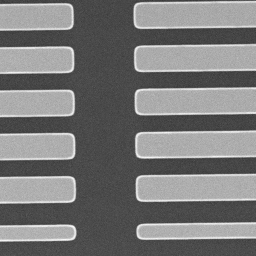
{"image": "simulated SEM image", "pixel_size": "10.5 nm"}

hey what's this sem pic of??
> groups of lines, slits or small figures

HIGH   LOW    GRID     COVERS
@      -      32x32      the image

-----------------@@@@@@@@@@@@@@@
@@@@@@@@@--------@@@@@@@@@@@@@@@
@@@@@@@@@--------@@@@@@@@@@@@@@@
@@@@@@@@@--------@@@@@----------
--------------------------------
--------------------------------
@@@@@@@@@--------@@@@@@@@@@@@@@@
@@@@@@@@@--------@@@@@@@@@@@@@@@
@@@@@@@@@--------@@@@@@@@@@@@@@@
--------------------------------
--------------------------------
@@@@@@@@@--------@@@@@@@@@@@@@@@
@@@@@@@@@--------@@@@@@@@@@@@@@@
@@@@@@@@@--------@@@@@@@@@@@@@@@
@@@@@---------------------------
--------------------------------
----------------------@@@@@@@@@@
@@@@@@@@@--------@@@@@@@@@@@@@@@
@@@@@@@@@--------@@@@@@@@@@@@@@@
@@@@@@@@@--------@@@@@@@@@@@@@@@
--------------------------------
--------------------------------
@@@@@@@@@--------@@@@@@@@@@@@@@@
@@@@@@@@@--------@@@@@@@@@@@@@@@
@@@@@@@@@--------@@@@@@@@@@@@@@@
--------------------------------
--------------------------------
--------------------------------
@@@@@@@@@--------@@@@@@@@@@@@@@@
@@@@@@@@@--------@@@@@@@@@@@@@@@
--------------------------------
--------------------------------